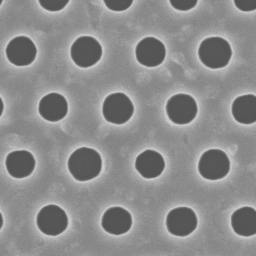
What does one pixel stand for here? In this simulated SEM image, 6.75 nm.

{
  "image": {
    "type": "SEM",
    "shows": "a regular array of holes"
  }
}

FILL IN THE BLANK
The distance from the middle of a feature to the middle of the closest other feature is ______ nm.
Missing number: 434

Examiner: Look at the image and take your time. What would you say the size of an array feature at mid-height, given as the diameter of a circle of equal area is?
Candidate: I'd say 203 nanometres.